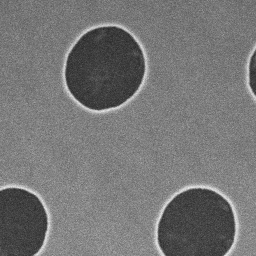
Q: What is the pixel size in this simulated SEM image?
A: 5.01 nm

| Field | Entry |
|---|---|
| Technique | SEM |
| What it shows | holes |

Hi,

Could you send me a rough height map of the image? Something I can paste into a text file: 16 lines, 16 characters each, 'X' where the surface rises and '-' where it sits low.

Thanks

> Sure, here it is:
XXXXXXXXXXXXXXXX
XXXXXXXXXXXXXXXX
XXXXX---XXXXXXXX
XXXX-----XXXXXXX
XXXX-----XXXXXXX
XXXX-----XXXXXXX
XXXXX---XXXXXXXX
XXXXXXXXXXXXXXXX
XXXXXXXXXXXXXXXX
XXXXXXXXXXXXXXXX
XXXXXXXXXXXXXXXX
XXXXXXXXXXXXXXXX
--XXXXXXXXX---XX
---XXXXXXX-----X
---XXXXXXX-----X
---XXXXXXX----XX